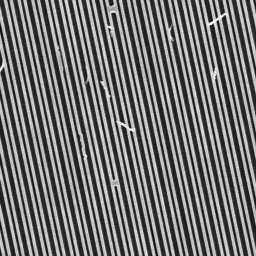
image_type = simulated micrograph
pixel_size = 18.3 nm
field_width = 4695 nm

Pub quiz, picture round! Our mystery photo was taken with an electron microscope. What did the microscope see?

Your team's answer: parallel lines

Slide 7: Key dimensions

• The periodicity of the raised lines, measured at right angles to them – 123 nanometres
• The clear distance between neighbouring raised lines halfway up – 0.0853 µm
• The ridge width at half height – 51.7 nanometres